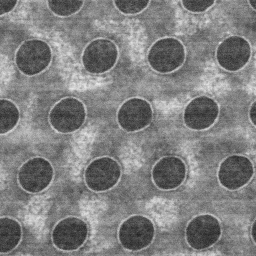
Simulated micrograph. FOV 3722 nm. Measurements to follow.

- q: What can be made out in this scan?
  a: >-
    a regular array of raised bodies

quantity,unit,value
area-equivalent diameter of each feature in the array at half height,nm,524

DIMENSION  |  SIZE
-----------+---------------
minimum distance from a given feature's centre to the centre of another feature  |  967 nm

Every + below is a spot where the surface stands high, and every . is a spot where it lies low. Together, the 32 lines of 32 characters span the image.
++....++++....+++++....++++....+
+......+++.....+++......+.......
................................
................................
.............................+..
...+++.....+++.....++++....++++.
..++++....+++++....++++....++++.
..++++....+++++...+++++....++++.
..++++.....+++.....+++......++..
................................
................................
................................
+.......++......++......+++.....
++.....++++....++++....++++....+
++....+++++....++++....++++....+
++....++++.....++++....++++.....
+......++.......................
................................
................................
.............................++.
...+++.....++++....++++.....++++
..+++++....++++....++++....+++++
..++++.....++++....++++....++++.
...+++.....+++......++......++..
................................
................................
................................
++......++......+++.....+++.....
+++....++++....++++....+++++...+
+++....++++....++++....+++++...+
++.....+++.....++++.....+++.....
+...............................